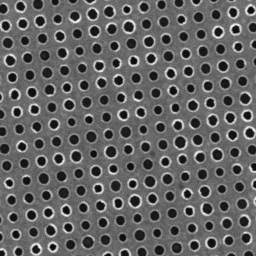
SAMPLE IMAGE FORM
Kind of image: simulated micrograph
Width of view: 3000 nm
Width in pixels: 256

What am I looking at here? a regular array of holes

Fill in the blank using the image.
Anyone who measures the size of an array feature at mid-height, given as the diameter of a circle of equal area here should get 111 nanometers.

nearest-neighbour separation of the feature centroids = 201 nanometers